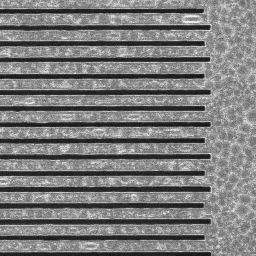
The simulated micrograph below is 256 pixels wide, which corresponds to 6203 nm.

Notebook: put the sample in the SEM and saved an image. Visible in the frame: parallel lines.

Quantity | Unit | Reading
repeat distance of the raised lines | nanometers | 393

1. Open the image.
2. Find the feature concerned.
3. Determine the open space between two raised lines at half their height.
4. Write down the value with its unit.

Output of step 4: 112 nm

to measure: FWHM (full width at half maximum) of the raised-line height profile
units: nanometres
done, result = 266